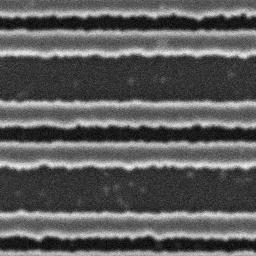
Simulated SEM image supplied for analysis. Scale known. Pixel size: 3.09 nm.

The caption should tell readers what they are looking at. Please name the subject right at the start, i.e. lines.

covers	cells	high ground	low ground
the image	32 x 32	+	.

++++++++++++++++++++++++++++++++
++++++++++++++++++++++++++++++++
................................
................................
++++++++++++++++++++++++++++++++
++++++++++++++++++++++++++++++++
++++++++++++++++++++++++++++++++
................................
................................
................................
................................
................................
................................
++++++++++++++++++++++++++++++++
++++++++++++++++++++++++++++++++
++++++++++++++++++++++++++++++++
................................
................................
++++++++++++++++++++++++++++++++
++++++++++++++++++++++++++++++++
++++++++++++++++++++++++++++++++
................................
................................
................................
................................
................................
..+.............................
++++++++++++++++++++++++++++++++
++++++++++++++++++++++++++++++++
++.+++++++++++++++.+++++++++++++
................................
.+.++......+.....++...........++